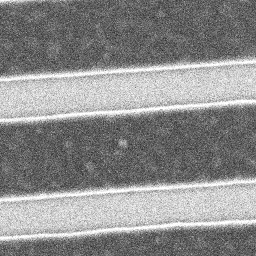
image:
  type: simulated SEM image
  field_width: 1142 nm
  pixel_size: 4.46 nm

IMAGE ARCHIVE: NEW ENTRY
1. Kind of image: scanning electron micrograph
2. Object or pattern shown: one or a few lines or trenches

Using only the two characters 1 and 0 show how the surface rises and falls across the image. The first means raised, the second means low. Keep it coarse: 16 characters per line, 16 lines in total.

1111111111111111
1111111111111111
1111111111111111
1111111111111111
1111111100000000
0000000000000000
0000000000000111
1111111111111111
1111111111111111
1111111111111111
1111111111111111
1111111111111110
1000000000000000
0000000000000000
0000011111111111
1111111111111111